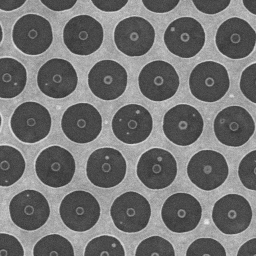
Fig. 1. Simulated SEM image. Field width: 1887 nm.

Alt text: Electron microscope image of an array of small figures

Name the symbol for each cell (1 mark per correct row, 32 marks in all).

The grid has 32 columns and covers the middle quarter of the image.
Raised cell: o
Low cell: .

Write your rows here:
..ooooo........ooooo.......ooooo
...oooo........oooo.........oooo
...ooo..........ooo.........oooo
....oo.....o....ooo....o.....oo.
...ooo....oo....ooo....oo....oo.
...ooo..........ooo..........oo.
...oooo........oooo.........ooo.
..ooooo........ooooo........oooo
ooooooooo....oooooooo......ooooo
ooooooooooooooooooooooo.oooooooo
oo.....oooooooo.....oooooooo....
........ooooo........ooooo......
.........oooo.........ooo.......
.........ooo..........ooo.......
....o.....oo....oo....ooo.......
....o.....oo....oo....ooo....o..
.........ooo..........ooo.......
.........ooo..........ooo.......
o.......ooooo........ooooo......
ooo....oooooooo.....ooooooo.....
ooooooooooooooooooooooooooooo.oo
.ooooooo.....oooooooo....ooooooo
..ooooo........ooooo.......ooooo
..oooo.........oooo.........oooo
...ooo..........oo..........ooo.
...ooo....oo....oo.....o....ooo.
...oo.....o.....oo....oo....oo..
...ooo.........ooo..........ooo.
..oooo.........oooo.........ooo.
..ooooo.......ooooo........ooooo
oooooooo.....ooooooo......oooooo
oooooooooooooooooooooo..oooooooo